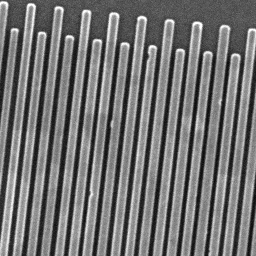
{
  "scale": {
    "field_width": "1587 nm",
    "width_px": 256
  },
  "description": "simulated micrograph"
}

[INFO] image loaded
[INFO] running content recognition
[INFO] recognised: parallel lines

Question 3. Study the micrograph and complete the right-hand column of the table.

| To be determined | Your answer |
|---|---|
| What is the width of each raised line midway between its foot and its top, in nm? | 53.1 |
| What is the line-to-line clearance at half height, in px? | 5.71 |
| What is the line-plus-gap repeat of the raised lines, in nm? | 86.4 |